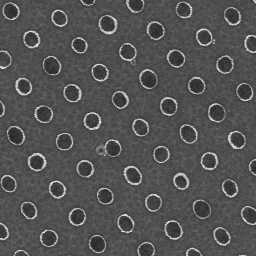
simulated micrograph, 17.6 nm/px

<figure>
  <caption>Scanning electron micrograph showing a regular array of raised bodies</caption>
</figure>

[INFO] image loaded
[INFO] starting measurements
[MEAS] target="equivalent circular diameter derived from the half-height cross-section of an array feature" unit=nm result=296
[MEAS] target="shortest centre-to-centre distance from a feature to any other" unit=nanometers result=596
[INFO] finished